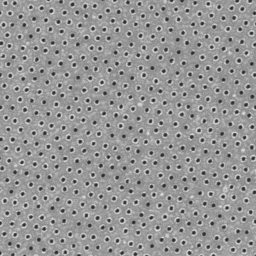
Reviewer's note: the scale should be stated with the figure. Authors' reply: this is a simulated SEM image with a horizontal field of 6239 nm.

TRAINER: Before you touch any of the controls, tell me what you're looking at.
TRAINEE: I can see a regular array of holes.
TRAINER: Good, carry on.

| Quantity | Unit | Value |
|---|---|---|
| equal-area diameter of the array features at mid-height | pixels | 4.22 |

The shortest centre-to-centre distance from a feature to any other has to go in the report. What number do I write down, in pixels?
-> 10.4